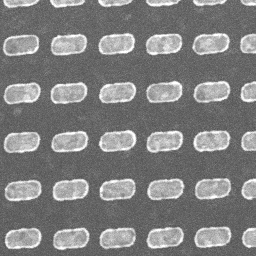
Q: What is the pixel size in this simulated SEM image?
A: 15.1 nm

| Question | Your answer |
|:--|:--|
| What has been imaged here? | a regular array of raised bodies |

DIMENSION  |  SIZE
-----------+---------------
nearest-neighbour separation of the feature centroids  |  709 nm